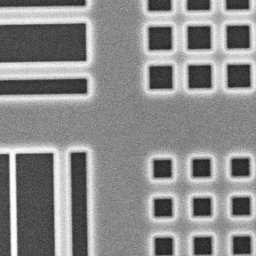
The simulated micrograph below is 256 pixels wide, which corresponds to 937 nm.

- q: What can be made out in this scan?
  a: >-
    groups of lines, slits or small figures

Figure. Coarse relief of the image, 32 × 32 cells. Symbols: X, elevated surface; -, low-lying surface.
-----------XXXXXXX----X---XX---X
XXXXXXXXXXXXXXXXXXX--XXXXXXXXXXX
XXXXXXXXXXXXXXXXXXXXXXXXXXXXXXXX
-----------XXXXXXX----X---XX---X
-----------XXXXXXX----X----X---X
-----------XXXXXXX----X----X---X
-----------XXXXXXXX--XXXXXXXXXXX
-----------XXXXXXXXXXXXXXXXXXXXX
XXXXXXXXXXXXXXXXXX----X----X---X
XXXXXXXXXXXXXXXXXX----X----X----
-----------XXXXXXX----X----X----
-----------XXXXXXXXXXXXXXXXXXXXX
XXXXXXXXXXXXXXXXXXXXXXXXXXXXXXXX
XXXXXXXXXXXXXXXXXXXXXXXXXXXXXXXX
XXXXXXXXXXXXXXXXXXXXXXXXXXXXXXXX
XXXXXXXXXXXXXXXXXXXXXXXXXXXXXXXX
XXXXXXXXXXXXXXXXXXXXXXXXXXXXXXXX
XXXXXXXXXXXXXXXXXXXXXXXXXXXXXXXX
XXXXXXXXXXXXXXXXXXXXXXXXXXXXXXXX
-------XX--XXXXXXXXXXXXXXXXXXX-X
-------XX--XXXXXXXX---XX---XX--X
-------XX--XXXXXXXX---XX---XX--X
-------XX--XXXXXXXXXXXXXXXXXXXXX
-------XX--XXXXXXXXXXXXXXXXXXXXX
-------XX--XXXXXXXXXXXXXXXXXXX-X
-------XX--XXXXXXXX---XX---XX--X
-------XX--XXXXXXXX---XX---XX--X
-------XX--XXXXXXXXXXXXXXXXXXXXX
-------XX--XXXXXXXXXXXXXXXXXXXXX
-------XX--XXXXXXXXX-XXXX-XXX--X
-------XX--XXXXXXXX---XX---XX---
-------XX--XXXXXXXX---XX---XX--X